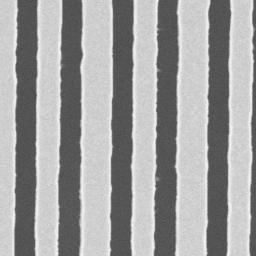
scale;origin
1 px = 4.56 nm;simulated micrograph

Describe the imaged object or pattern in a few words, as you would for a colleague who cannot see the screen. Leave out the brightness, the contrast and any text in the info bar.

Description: lines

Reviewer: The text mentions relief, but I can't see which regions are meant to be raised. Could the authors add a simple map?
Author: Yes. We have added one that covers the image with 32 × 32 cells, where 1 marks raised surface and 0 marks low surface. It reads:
11000111001111000111001111000111
11000111001111000111001111000111
11000111001111000111001111000110
11000111001111000111001111000111
11000111001111000111001111000111
11000111001111000111001111000111
11000111001111000111001111000111
11000111001111000111001111000111
11000111001111000111001111000111
11000111001111000111001111000111
11000111001111000111001111000111
11000111001111000111001111000110
11000111001111000111001111000110
11000111001111000111001111000110
11000110001111000111001111000110
11000110001111000111001111000110
11000110001111000111001111000110
11000110001111000111001111000110
11000110001111000110001111000110
11000110001111000111001111001110
11000110001111001111001111000110
11000110001111001110001111000110
11000110001111000110001111000110
11000110001111000110001111001110
11000110001111000110001111001110
11001110001111000110001111000110
11001110001111000110001111001110
11001110001111001110001111001110
11001110001111001110001111001110
11001110001111001110001111001110
11001110001111001110001111001110
11001110001111001110001111001110